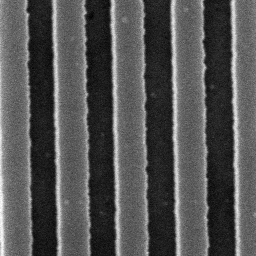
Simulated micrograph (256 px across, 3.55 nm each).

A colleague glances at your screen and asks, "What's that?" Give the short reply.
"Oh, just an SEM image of lines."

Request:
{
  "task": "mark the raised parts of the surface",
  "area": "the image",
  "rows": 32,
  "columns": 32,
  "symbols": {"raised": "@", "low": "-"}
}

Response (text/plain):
@@@----@@@@---@@@@---@@@@----@@@
@@@----@@@@---@@@@---@@@@----@@@
@@@----@@@@---@@@@---@@@@----@@@
@@@----@@@@---@@@@----@@@----@@@
@@@@---@@@@---@@@@----@@@----@@@
@@@----@@@@---@@@@----@@@----@@@
@@@----@@@@---@@@@----@@@----@@@
@@@----@@@@---@@@@----@@@----@@@
@@@----@@@@---@@@@----@@@@---@@@
@@@@---@@@@---@@@@----@@@----@@@
@@@@---@@@@---@@@@----@@@----@@@
@@@@---@@@@---@@@@----@@@@---@@@
@@@@---@@@@---@@@@----@@@@---@@@
@@@@---@@@@---@@@@----@@@@---@@@
@@@@---@@@@---@@@@----@@@@---@@@
@@@@---@@@@---@@@@----@@@@---@@@
@@@@---@@@@---@@@@----@@@@---@@@
@@@@---@@@@---@@@@----@@@@---@@@
@@@@---@@@@---@@@@----@@@@---@@@
@@@@---@@@@---@@@@----@@@@---@@@
@@@@---@@@@---@@@@----@@@@---@@@
@@@@---@@@@---@@@@----@@@@---@@@
@@@@---@@@@---@@@@----@@@@---@@@
@@@@---@@@@---@@@@----@@@@---@@@
@@@@---@@@@---@@@@----@@@@---@@@
@@@@---@@@@---@@@@----@@@@---@@@
@@@@---@@@@----@@@----@@@@---@@@
@@@@---@@@@---@@@@----@@@@---@@@
@@@@---@@@@----@@@----@@@@----@@
@@@@---@@@@----@@@----@@@@----@@
@@@@---@@@@----@@@----@@@@----@@
@@@@---@@@@----@@@----@@@@----@@